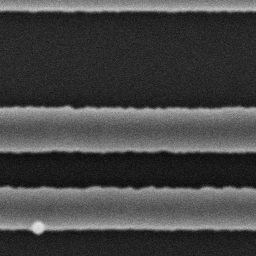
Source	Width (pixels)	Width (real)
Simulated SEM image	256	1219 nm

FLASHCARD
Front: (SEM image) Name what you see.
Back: lines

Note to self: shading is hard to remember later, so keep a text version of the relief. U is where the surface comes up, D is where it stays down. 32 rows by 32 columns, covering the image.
UUUUUUUUUUUUUUUUUUUUUUUUUUUUUUUU
DDDDDDDDDDDDDDDDDDDDDDDDDDDDDDDD
DDDDDDDDDDDDDDDDDDDDDDDDDDDDDDDD
DDDDDDDDDDDDDDDDDDDDDDDDDDDDDDDD
DDDDDDDDDDDDDDDDDDDDDDDDDDDDDDDD
DDDDDDDDDDDDDDDDDDDDDDDDDDDDDDDD
DDDDDDDDDDDDDDDDDDDDDDDDDDDDDDDD
DDDDDDDDDDDDDDDDDDDDDDDDDDDDDDDD
DDDDDDDDDDDDDDDDDDDDDDDDDDDDDDDD
DDDDDDDDDDDDDDDDDDDDDDDDDDDDDDDD
DDDDDDDDDDDDDDDDDDDDDDDDDDDDDDDD
DDDDDDDDDDDDDDDDDDDDDDDDDDDDDDDD
DDDDDDDDDDDDDDDDDDDDDDDDDDDDDDDD
UUUUUUUUUDUUUUUDUDDDDUUDDDDDUUUU
UUUUUUUUUUUUUUUUUUUUUUUUUUUUUUUU
UUUUUUUUUUUUUUUUUUUUUUUUUUUUUUUU
UUUUUUUUUUUUUUUUUUUUUUUUUUUUUUUU
UUUUUUUUUUUUUUUUUUUUUUUUUUUUUUUU
UUUUUUUUUUUUUUUUUUUUUUUUUUUUUUUU
DDDDDDDDDDDDDDDDDDDDDDDDDDDDDDDD
DDDDDDDDDDDDDDDDDDDDDDDDDDDDDDDD
DDDDDDDDDDDDDDDDDDDDDDDDDDDDDDDD
DDDDDDDDDDDDDDDDDDDDDDDDDDDDDDDD
UUDDDUUDDDDUUUUDDDUUUDUDDUUDUDUD
UUUUUUUUUUUUUUUUUUUUUUUUUUUUUUUU
UUUUUUUUUUUUUUUUUUUUUUUUUUUUUUUU
UUUUUUUUUUUUUUUUUUUUUUUUUUUUUUUU
UUUUUUUUUUUUUUUUUUUUUUUUUUUUUUUU
UUUUUUUUUUUUUUUUUUUUUUUUUUUUUUUU
DDDDDDDDDDDDDDDDDDDDDDDDDDDDDDDD
DDDDDDDDDDDDDDDDDDDDDDDDDDDDDDDD
DDDDDDDDDDDDDDDDDDDDDDDDDDDDDDDD